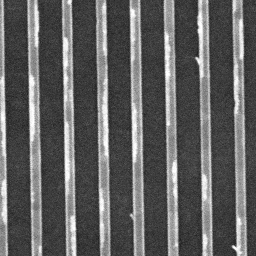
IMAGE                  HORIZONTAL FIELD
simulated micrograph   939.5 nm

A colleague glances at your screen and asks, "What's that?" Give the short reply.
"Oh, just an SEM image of parallel lines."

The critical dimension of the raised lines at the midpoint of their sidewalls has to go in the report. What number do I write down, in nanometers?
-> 33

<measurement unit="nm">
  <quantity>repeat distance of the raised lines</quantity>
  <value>125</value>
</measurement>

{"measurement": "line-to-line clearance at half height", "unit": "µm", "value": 0.0927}